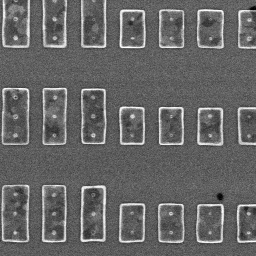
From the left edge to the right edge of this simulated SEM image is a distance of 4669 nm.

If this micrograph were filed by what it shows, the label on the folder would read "wiring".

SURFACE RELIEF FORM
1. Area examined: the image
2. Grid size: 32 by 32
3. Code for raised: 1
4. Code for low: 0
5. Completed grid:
11110111001110000000000000000000
01110011001110011100111001110011
11110011001110011100111001110011
11110011001110011100111001110011
11110011001110011100111001110011
01100011001110011100111001110011
00000000000000000000000000000000
00000000000000000000000000000000
00000000000000000000000000000000
00000000000000000000000000000000
00000000000000000000000000000000
11100111001110000000000000000000
11110111001110000000000000000000
01110011001110011000100000000000
11100011001110011100111001110011
11100011001110011100111001110011
11100011001110011100111001110011
11100011001110011100111001110011
00000000000000000000000000000000
00000000000000000000000000000000
00000000000000000000000000000000
00000000000000000000000000000000
00000000000000000000000000000000
01100011000110000000000000000000
11100111001110000000000000000000
11100111001110000000000000000000
11100111001110011100111001110011
11100111001110011100111001110011
11100111001110011100111001110011
11100111001110011100111001110011
00000000000000000000000000000000
00000000000000000000000000000000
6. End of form